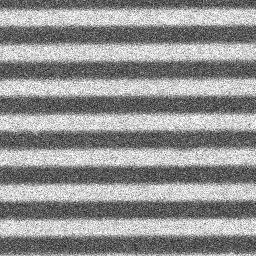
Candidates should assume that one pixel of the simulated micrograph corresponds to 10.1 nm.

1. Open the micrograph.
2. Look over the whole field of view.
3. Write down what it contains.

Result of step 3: parallel lines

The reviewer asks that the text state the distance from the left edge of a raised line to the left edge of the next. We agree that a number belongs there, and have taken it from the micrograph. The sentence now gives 353 nm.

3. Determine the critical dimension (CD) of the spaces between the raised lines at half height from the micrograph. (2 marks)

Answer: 0.169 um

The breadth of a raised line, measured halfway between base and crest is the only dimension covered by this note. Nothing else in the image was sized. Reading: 0.187 micrometres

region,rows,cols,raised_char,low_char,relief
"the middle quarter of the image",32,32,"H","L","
LLLLLLLLLLLLLLLLLLLLLLLLLLLLLLLL
LLLLLLLLLLLLLLLLLLLLLLLLLLLLLLLL
LLLLLLLLLLLLLLLLLLLLLLLLLLLLLLLL
LLLLLLLLLLLLLLLLLLLLLLLLLLLLLLLL
HHHHHHHHHHHHHHHHHHHHHHHHHHHHHHHH
HHHHHHHHHHHHHHHHHHHHHHHHHHHHHHHH
HHHHHHHHHHHHHHHHHHHHHHHHHHHHHHHH
HHHHHHHHHHHHHHHHHHHHHHHHHHHHHHHH
LLLLLLLLLLLLLLLLLLLLLLLLLLLLLLLL
LLLLLLLLLLLLLLLLLLLLLLLLLLLLLLLL
LLLLLLLLLLLLLLLLLLLLLLLLLLLLLLLL
LLLLLLLLLLLLLLLLLLLLLLLLLLLLLLLL
LLHHHHHHHHHHHHHHHHHHHHHHHHHHHHHH
HHHHHHHHHHHHHHHHHHHHHHHHHHHHHHHH
HHHHHHHHHHHHHHHHHHHHHHHHHHHHHHHH
HHHHHHHHHHHHHHHHHHHHHHHHHHHHHHHH
HHHHHHHHHHHHHHHHHHHHHHHHHHHHHHHH
LLLLLLLLLLLLLLLLLLLLLLLLLLLLLLLL
LLLLLLLLLLLLLLLLLLLLLLLLLLLLLLLL
LLLLLLLLLLLLLLLLLLLLLLLLLLLLLLLL
LLLLLLLLLLLLLLLLLLLLLLLLLLLLLLLL
HHHHHHHHHHHHHHHHHHHHHHHHHHHHHLLH
HHHHHHHHHHHHHHHHHHHHHHHHHHHHHHHH
HHHHHHHHHHHHHHHHHHHHHHHHHHHHHHHH
HHHHHHHHHHHHHHHHHHHHHHHHHHHHHHHH
HHHHHHHHHHHHHHHHHHHHHHHHHHHHHHHH
LLLLLLLLLLLLLLLLLLLLLLLLLLLLLLLL
LLLLLLLLLLLLLLLLLLLLLLLLLLLLLLLL
LLLLLLLLLLLLLLLLLLLLLLLLLLLLLLLL
LLLLLLLLLLLLLLLLLLLLLLLLLLLLLLLL
HHHHHHHHHHHHHHHHHHHHHHHHHHHHHHHH
HHHHHHHHHHHHHHHHHHHHHHHHHHHHHHHH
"